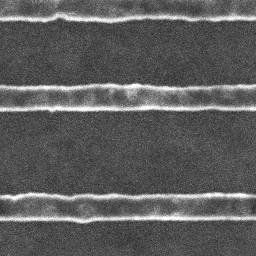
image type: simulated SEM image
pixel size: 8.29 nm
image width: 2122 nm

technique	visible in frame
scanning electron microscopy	one or a few lines or trenches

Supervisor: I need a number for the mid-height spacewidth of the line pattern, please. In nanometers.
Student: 645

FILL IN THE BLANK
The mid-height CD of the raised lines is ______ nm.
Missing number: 196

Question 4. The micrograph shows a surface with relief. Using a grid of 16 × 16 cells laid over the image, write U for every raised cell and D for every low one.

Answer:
UUUUUUUUUUUUUUUU
DDDDDDDDDDDDDDDD
DDDDDDDDDDDDDDDD
DDDDDDDDDDDDDDDD
DDDDDDDDDDDDDDDD
UUUUUUUUUUUDUUUU
UUUUUUUUUUUUUUUU
DDDDDDDDDDDDDDDD
DDDDDDDDDDDDDDDD
DDDDDDDDDDDDDDDD
DDDDDDDDDDDDDDDD
DDDDDDDDDDDDDDDD
UUUUUUUUUUUUUUUU
UUUUUUUUUUUUUUUU
DDDDDDDDDDDDDDDD
DDDDDDDDDDDDDDDD